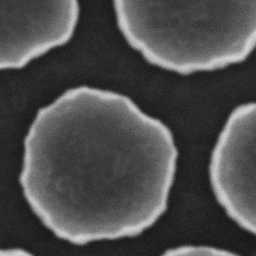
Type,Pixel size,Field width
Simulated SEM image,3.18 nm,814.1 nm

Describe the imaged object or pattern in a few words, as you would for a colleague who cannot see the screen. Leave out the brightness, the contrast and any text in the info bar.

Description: raised bodies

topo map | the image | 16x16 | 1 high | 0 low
1111100111111111
1111100011111111
1111000011111111
1100000001111110
0000000000000000
0000000000000000
0001111100000000
0011111111000011
0011111111100011
0011111111100011
0011111111100111
0111111111100111
0011111111000011
0001111111000001
0000111100000000
0000000000001000